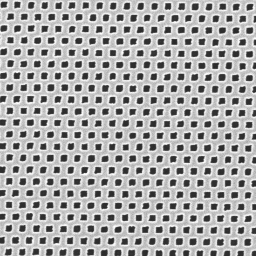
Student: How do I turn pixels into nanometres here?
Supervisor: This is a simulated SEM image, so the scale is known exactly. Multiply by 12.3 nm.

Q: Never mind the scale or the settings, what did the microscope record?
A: a regular array of holes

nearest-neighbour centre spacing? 163 nanometers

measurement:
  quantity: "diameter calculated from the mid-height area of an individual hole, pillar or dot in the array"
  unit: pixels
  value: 7.49